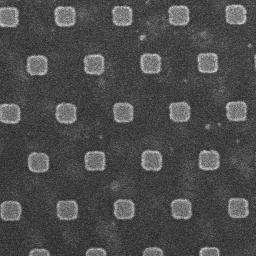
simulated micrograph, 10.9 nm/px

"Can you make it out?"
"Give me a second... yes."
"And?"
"a regular array of raised bodies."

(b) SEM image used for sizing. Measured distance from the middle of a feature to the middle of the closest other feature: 608 nm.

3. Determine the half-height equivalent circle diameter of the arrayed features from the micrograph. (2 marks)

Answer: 20.4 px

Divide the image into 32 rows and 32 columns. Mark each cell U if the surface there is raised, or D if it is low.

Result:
DDDDDDDDDDDDDDDDDDDDDDDDDDDDDDDD
UUDDDDDUUDDDDDUUDDDDDUUDDDDDUUUD
UUDDDDDUUDDDDDUUDDDDDUUDDDDDUUUD
DDDDDDDDDDDDDDDDDDDDDDDDDDDDDDDD
DDDDDDDDDDDDDDDDDDDDDDDDDDDDDDDD
DDDDDDDDDDDDDDDDDDDDDDDDDDDDDDDD
DDDDDDDDDDDDDDDDDDDDDDDDDDDDDDDD
DDDDUUDDDDDUUDDDDDUUDDDDDUUDDDDD
DDDDUUDDDDDUUDDDDDUUDDDDDUUDDDDD
DDDDDDDDDDDDDDDDDDDDDDDDDDDDDDDD
DDDDDDDDDDDDDDDDDDDDDDDDDDDDDDDD
DDDDDDDDDDDDDDDDDDDDDDDDDDDDDDDD
DDDDDDDDDDDDDDDDDDDDDDDDDDDDDDDD
UUDDDDDUUDDDDDUUUDDDDUUUDDDDUUUD
UUDDDDDUUDDDDDUUUDDDDUUUDDDDUUUD
DDDDDDDDDDDDDDDDDDDDDDDDDDDDDDDD
DDDDDDDDDDDDDDDDDDDDDDDDDDDDDDDD
DDDDDDDDDDDDDDDDDDDDDDDDDDDDDDDD
DDDDDDDDDDDDDDDDDDDDDDDDDDDDDDDD
DDDDUUDDDDDUUDDDDDUUDDDDDUUDDDDD
DDDDUUDDDDDUUDDDDDUUDDDDDUUDDDDD
DDDDDDDDDDDDDDDDDDDDDDDDDDDDDDDD
DDDDDDDDDDDDDDDDDDDDDDDDDDDDDDDD
DDDDDDDDDDDDDDDDDDDDDDDDDDDDDDDD
DDDDDDDDDDDDDDDDDDDDDDDDDDDDDDDD
UUDDDDDUUDDDDDUUUDDDDDUUDDDDDUUD
UUUDDDDUUUDDDDUUUDDDDDUUDDDDDUUD
DDDDDDDDDDDDDDDDDDDDDDDDDDDDDDDD
DDDDDDDDDDDDDDDDDDDDDDDDDDDDDDDD
DDDDDDDDDDDDDDDDDDDDDDDDDDDDDDDD
DDDDDDDDDDDDDDDDDDDDDDDDDDDDDDDD
DDDDUUDDDDDUUDDDDDUUDDDDDUUDDDDD